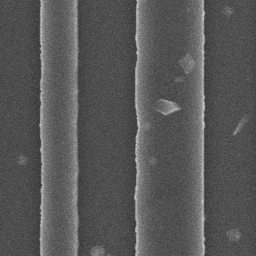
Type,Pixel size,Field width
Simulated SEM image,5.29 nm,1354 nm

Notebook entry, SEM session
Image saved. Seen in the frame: lines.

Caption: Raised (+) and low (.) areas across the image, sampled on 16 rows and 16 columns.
...++....++++...
...++....++++...
...++....++++...
...++....++++...
...++....++++...
...++....++++...
...++....++++...
...++....++++...
...++....++++...
...++....++++...
...++....++++...
...++....++++...
...++...+++++...
...++....++++...
...++....++++...
...++....++++...